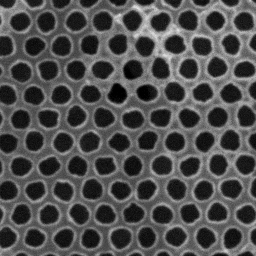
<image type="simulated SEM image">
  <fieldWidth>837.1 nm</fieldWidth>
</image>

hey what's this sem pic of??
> a regular array of holes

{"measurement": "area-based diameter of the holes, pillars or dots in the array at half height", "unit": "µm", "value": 0.0673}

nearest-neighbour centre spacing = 86.5 nanometers